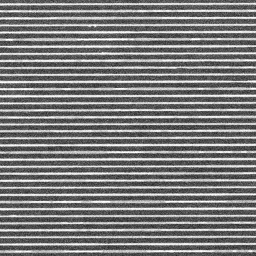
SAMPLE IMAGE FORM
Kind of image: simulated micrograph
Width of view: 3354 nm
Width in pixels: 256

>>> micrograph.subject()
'parallel lines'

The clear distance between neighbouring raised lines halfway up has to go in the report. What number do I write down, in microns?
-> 0.0721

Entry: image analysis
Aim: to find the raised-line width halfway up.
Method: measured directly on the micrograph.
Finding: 13.1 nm